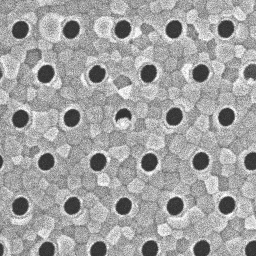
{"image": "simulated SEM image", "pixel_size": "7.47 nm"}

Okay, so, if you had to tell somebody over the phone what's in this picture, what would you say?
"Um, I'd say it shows a regular array of holes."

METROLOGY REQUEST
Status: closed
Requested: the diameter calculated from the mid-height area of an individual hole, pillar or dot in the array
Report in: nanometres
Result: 132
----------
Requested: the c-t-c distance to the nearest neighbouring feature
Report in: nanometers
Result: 379